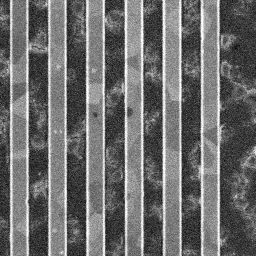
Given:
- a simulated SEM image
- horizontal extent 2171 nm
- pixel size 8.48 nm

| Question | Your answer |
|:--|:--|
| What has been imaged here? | parallel lines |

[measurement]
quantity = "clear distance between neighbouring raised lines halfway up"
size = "186 nanometres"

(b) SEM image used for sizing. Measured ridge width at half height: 139 nm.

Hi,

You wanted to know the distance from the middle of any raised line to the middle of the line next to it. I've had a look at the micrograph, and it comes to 324 nm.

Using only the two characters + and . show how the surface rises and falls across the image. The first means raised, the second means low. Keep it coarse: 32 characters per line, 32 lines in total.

.++...++...++...++...+...++.....
.++...++...++...++...+...++.....
.++...++...++...++...+...++.....
.++...++...++...++...++..++.....
.++...++...++...++...++..++.....
.++...++...++...++...++..++.....
.++...++...++...++...++..++.....
.++...++...++...++...++..++.....
.++...++...++...++...++..++.....
.++...++...++...++...++..++.....
.++...++...++...++...++..++.....
.++...++...++...++...++..++.....
.++...++...++...++...++..++....+
.++...++...++...++...++..++.....
.++...++...++...++...++..++.....
.++...++...++...++...++..++.....
.++...++...++...++...++..++.....
.++...++...++...++...++..++.....
.++...++...++...++...++..++.....
.++...++...++...++...++..++.....
.++...++...++...++...++..++.....
.++...++...++...++...++..++.....
.++...++...++...++...++..++.....
.++...++...++...++...++..++.....
.++...++...++...++...++..++.....
.++...++...++...++...++..++.....
.++...++...++...++...++..++.....
.++...++...++...++...++..++.....
.++...++...++...++...++..++.....
.++...++...++...++...++..++.....
.++...++...++...++...++..++.....
.++...++...++...++...++..++.....